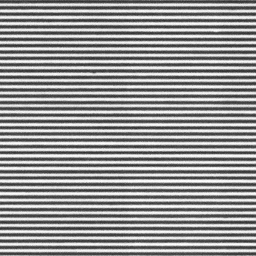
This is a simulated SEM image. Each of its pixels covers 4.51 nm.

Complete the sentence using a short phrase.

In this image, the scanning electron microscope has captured parallel lines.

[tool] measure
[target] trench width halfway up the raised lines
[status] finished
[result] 18.6 nm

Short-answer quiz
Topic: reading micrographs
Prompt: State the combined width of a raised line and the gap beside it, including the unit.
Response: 28.4 nanometres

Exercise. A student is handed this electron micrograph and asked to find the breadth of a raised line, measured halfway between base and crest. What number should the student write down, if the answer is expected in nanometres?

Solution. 11.3